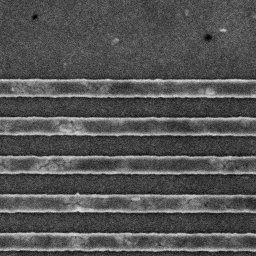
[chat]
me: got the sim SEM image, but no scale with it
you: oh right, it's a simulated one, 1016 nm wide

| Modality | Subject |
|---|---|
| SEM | parallel lines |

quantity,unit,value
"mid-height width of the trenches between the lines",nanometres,83.8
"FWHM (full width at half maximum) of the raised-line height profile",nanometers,67.5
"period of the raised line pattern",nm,153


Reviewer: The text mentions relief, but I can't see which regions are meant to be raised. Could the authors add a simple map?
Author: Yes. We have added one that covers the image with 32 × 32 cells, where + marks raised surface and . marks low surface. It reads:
................................
................................
................................
................................
................................
................................
................................
................................
................................
................................
++++++++++++++++++++++++++++++++
++++++++++++++++++++++++++++++++
................................
................................
................................
++++++++++++++++++++++++++++++++
++++++++++++++++++++++++++++++++
................................
................................
.................++...+.........
++++++++++++++++++++++++++++++++
++++++++++++++++++++++++++++++++
................................
................................
++++++++++++++++++++++++++++++++
++++++++++++++++++++++++++++++++
++.++++++.....+++++..++++.++.+.+
................................
................................
++++++++++++++++++++++++++++++++
++++++++++++++++++++++++++++++++
................................